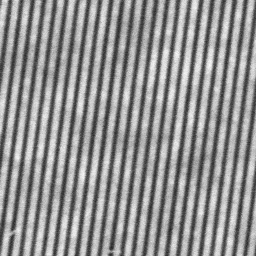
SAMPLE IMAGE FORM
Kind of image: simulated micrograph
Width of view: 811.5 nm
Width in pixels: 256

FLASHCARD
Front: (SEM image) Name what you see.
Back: parallel lines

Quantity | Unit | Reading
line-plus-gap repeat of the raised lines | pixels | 11.1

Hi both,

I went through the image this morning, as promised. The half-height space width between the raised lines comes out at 4.95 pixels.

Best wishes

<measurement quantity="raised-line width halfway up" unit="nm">19.2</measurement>